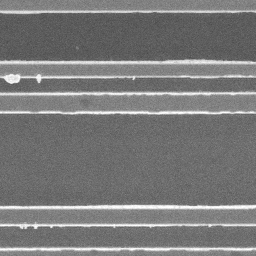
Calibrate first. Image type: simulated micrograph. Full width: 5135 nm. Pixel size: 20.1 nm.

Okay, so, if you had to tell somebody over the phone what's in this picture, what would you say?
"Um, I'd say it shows lines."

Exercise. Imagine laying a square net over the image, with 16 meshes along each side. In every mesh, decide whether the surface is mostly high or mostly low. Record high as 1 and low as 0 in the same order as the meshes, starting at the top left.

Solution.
1111111111111111
0000000000000000
0000000000000000
0000000000000000
1111111111111111
1111111111111111
1111111111111111
0000000000000000
0000000000000000
0000000000000000
0000000000000000
0000000000000000
0000000000000000
1111111111111111
1111111111111111
1111111111111111